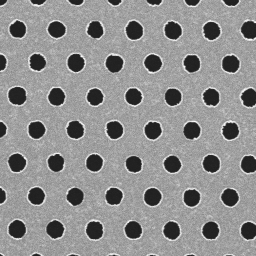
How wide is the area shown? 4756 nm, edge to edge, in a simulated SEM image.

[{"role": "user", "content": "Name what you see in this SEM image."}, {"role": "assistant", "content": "a regular array of holes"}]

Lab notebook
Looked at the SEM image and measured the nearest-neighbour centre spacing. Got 707 nm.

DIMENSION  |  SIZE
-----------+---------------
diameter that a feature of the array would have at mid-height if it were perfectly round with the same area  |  327 nm